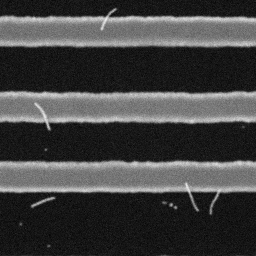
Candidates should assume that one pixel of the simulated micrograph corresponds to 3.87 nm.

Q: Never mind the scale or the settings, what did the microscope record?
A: lines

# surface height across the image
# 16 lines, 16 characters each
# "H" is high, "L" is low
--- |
LLLLLLLLLLLLLLLL
HHHHHHHHHHHHHHHH
HHHHHHHHHHHHHHHH
LLLLLLLLLLLLLLLL
LLLLLLLLLLLLLLLL
LLLLLLLLLLLLLLLL
HHHHHHHHHHHHHHHH
HHHHHHHHHHHHHHHH
LLLLLLLLLLLLLLLL
LLLLLLLLLLLLLLLL
HHHHHHHHHHHHHHHH
HHHHHHHHHHHHHHHH
LLLLLLLLLLLLLLLL
LLLLLLLLLLLLLLLL
LLLLLLLLLLLLLLLL
LLLLLLLLLLLLLLLL